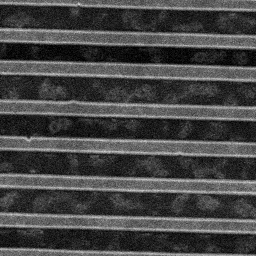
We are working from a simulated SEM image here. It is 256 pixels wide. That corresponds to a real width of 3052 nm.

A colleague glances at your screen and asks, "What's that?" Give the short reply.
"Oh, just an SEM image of parallel lines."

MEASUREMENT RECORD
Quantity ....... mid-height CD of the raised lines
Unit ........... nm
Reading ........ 152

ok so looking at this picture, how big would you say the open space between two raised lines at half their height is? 24.4 pixels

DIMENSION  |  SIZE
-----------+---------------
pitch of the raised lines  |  36.9 pixels